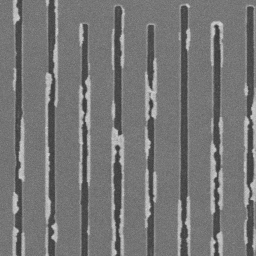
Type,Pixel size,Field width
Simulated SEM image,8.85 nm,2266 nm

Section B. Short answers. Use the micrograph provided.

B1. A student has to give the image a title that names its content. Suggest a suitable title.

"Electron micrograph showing parallel lines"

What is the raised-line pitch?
0.292 um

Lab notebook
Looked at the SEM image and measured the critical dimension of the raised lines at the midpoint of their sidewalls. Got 241 nm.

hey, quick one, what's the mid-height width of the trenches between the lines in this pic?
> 56.4 nm